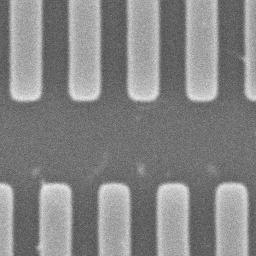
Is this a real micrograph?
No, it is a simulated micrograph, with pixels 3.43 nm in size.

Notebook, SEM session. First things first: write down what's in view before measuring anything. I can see groups of lines, slits or small figures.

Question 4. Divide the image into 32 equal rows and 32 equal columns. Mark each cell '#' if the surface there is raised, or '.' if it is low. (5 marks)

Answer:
..###....###....####....###....#
.####....###....####....###....#
.####....###....####....###....#
..###....###....####....###....#
..###....###....####....###....#
..###....###....####....###....#
..###....###....####....###....#
..###....###....####....###....#
..###....###....####....###....#
..###....###....####....###....#
..###....###....####....###....#
..###....###....####....###....#
................................
................................
................................
................................
................................
................................
................................
................................
................................
................................
................................
#....###.....###....###....###..
#....####....###....###....####.
#....####....###....###....####.
#....####....###....###....####.
#....####....###....###....####.
#....####....###....###....####.
#....####....###....###....####.
#....####....###....###....####.
#....####....###....###....####.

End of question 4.